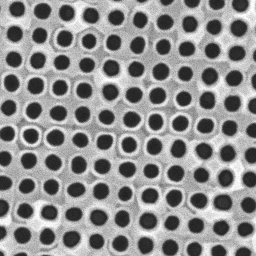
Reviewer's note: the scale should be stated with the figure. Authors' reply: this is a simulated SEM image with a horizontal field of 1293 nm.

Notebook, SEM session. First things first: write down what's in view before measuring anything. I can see a regular array of holes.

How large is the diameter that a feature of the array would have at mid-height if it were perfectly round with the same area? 80.8 nm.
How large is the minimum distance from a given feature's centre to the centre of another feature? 122 nanometres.